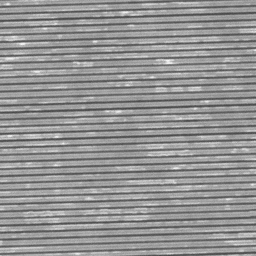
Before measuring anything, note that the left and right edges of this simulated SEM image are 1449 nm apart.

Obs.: parallel lines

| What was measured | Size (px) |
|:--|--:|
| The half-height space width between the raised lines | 2.61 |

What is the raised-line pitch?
0.0399 micrometres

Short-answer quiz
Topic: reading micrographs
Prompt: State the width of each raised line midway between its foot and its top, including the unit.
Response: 24 nanometers